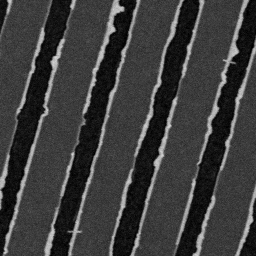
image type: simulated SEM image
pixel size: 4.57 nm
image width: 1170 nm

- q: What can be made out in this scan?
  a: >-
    one or a few lines or trenches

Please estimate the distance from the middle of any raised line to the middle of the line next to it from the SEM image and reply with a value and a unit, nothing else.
285 nanometers